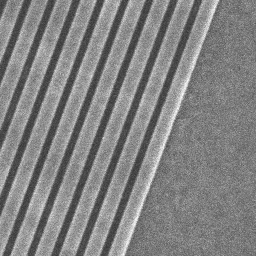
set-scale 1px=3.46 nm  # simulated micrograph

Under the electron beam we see parallel lines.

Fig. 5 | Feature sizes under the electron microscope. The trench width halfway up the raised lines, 28.8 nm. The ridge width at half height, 51.9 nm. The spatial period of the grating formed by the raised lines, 0.0792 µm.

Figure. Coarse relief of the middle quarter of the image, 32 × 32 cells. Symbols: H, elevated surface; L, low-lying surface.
HHLLHHHHLLHHHHLLHHHHLLLHHHHLLHHH
HHLLHHHHLLHHHHLLHHHHLLHHHHLLHHHH
HLLLHHHLLLHHHLLLHHHHLLHHHHLLHHHH
HLLHHHHLLHHHHLLHHHHLLHHHHLLHHHHL
HLLHHHHLLHHHHLLHHHHLLHHHHLLHHHHL
LLHHHHLLHHHHLLHHHHLLLHHHHLLHHHHL
LLHHHHLLHHHHLLHHHHLLHHHHLLHHHHLL
LLHHHLLLHHHHLLHHHHLLHHHHLLHHHHLL
LHHHHLLHHHHLLHHHHLLLHHHHLLHHHHLL
LHHHHLLHHHHLLHHHHLLHHHHLLHHHHLLL
LHHHLLLHHHHLLHHHHLLHHHHLLHHHHLLL
HHHHLLHHHHLLHHHHLLHHHHLLLHHHLLLL
HHHHLLHHHHLLHHHHLLHHHHLLHHHHLLLL
HHHLLHHHHLLHHHHLLLHHHHLLHHHHLLLL
HHHLLHHHHLLHHHHLLHHHHLLHHHHLLLLL
HHLLLHHHHLLHHHHLLHHHHLLHHHHLLLLL
HHLLHHHHLLHHHHLLLHHHLLLHHHHLLLLL
HHLLHHHHLLHHHHLLHHHHLLHHHHLLLLLL
HLLLHHHHLLHHHHLLHHHHLLHHHHLLLLLL
HLLHHHHLLHHHHLLLHHHHLLHHHHLLLLLL
HLLHHHHLLHHHHLLHHHHLLHHHHLLLLLLL
LLLHHHLLLHHHHLLHHHHLLHHHHLLLLLLL
LLHHHHLLHHHHLLHHHHLLHHHHLLLLLLLL
LLHHHHLLHHHHLLHHHHLLHHHHLLLLLLLL
LHHHHLLHHHHLLLHHHLLLHHHHLLLLLLLL
LHHHHLLHHHHLLHHHHLLHHHHLLLLLLLLL
LHHHHLLHHHHLLHHHHLLHHHHLLLLLLLLL
HHHHLLHHHHLLLHHHLLLHHHHLLLLLLLLL
HHHHLLHHHHLLHHHHLLHHHHLLLLLLLLLL
HHHHLLHHHHLLHHHHLLHHHHLLLLLLLLLL
HHHLLHHHHLLHHHHLLHHHHLLLLLLLLLLL
HHHLLHHHHLLHHHHLLHHHHLLLLLLLLLLL